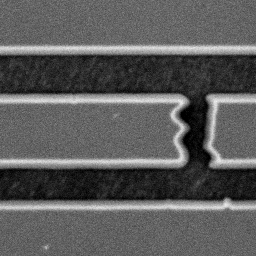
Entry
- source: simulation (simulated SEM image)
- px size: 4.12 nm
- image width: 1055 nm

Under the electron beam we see one or a few lines or trenches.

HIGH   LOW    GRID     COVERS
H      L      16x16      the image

HHHHHHHHHHHHHHHH
HHHHHHHHHHHHHHHH
HHHHHHHHHHHHHHHH
LLLLLLLLLLLLLLLL
LLLLLLLLLLLLLLLL
LLLLLLLLLLLLLLLL
HHHHHHHHHHHLLHHH
HHHHHHHHHHHLLHHH
HHHHHHHHHHHLLHHH
HHHHHHHHHHHLLHHH
LLLLLLLLLLLLLLLL
LLLLLLLLLLLLLLLL
LLLLLLLLLLLLLLLL
HHHHHHHHHHHHHHHH
HHHHHHHHHHHHHHHH
HHHHHHHHHHHHHHHH